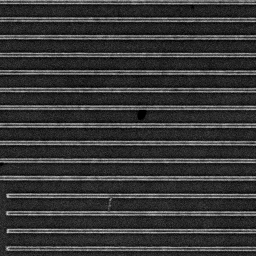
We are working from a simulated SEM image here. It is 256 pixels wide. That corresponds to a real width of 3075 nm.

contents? parallel lines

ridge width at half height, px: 2.75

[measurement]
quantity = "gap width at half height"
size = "14.3 px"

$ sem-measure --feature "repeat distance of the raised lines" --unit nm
211